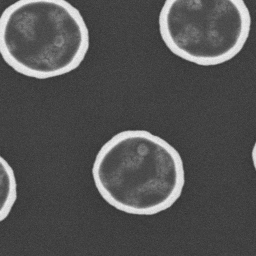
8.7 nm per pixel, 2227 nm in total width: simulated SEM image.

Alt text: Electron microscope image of raised bodies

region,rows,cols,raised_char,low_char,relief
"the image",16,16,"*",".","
.***......*****.
*****.....*****.
*****......****.
*****.......**..
..**............
................
................
................
........*.......
......*****.....
......*****.....
*.....*****.....
*......****.....
................
................
................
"